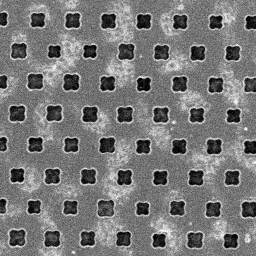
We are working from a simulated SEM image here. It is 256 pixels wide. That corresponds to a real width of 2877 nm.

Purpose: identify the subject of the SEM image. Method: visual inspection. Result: a regular array of holes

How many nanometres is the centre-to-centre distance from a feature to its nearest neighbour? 395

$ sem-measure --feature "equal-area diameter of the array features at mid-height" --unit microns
0.18